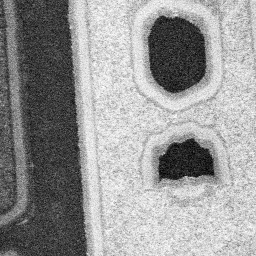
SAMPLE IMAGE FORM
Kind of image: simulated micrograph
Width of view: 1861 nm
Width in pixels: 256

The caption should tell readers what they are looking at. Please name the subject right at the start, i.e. one or a few lines or trenches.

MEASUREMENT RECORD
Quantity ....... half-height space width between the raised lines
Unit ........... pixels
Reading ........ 70.5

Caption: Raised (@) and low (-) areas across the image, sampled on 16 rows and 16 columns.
@----@@@@---@@@@
@----@@@@----@@@
@----@@@@----@@@
@----@@@@----@@@
@----@@@@-----@@
@----@@@@----@@@
@----@@@@@@@@@@@
@-----@@@@@@@@@@
@-----@@@@---@@@
@-----@@@-----@@
@-----@@@-----@@
@-----@@@-----@@
@-----@@@@@@@@@@
@-----@@@@@@@@@@
------@@@@@@@@@@
------@@@@@@@@@@